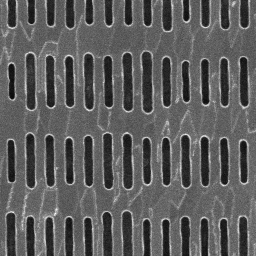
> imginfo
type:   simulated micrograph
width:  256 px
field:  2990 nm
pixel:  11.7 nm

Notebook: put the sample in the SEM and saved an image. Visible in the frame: a regular array of holes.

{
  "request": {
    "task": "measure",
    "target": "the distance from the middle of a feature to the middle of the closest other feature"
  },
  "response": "226 nm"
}